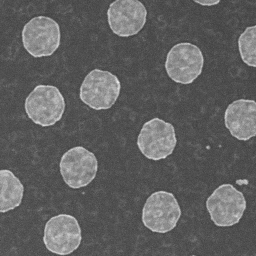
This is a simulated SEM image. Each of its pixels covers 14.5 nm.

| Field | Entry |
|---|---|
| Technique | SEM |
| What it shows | a regular array of raised bodies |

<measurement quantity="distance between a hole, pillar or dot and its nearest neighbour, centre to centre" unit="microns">1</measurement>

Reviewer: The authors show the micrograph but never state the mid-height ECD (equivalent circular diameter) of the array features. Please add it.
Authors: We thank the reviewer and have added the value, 562 nanometers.